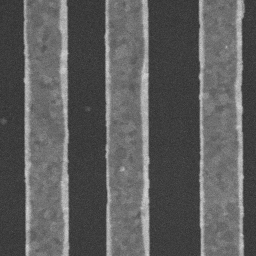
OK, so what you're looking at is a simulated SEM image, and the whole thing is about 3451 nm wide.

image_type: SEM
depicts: lines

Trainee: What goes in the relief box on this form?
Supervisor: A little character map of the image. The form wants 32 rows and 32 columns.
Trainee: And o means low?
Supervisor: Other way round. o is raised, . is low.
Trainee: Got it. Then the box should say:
...ooooo.....ooooo.......ooooo..
...ooooo.....ooooo.......ooooo..
...ooooo.....ooooo.......ooooo..
...ooooo.....ooooo.......ooooo..
...ooooo.....ooooo.......ooooo..
...ooooo.....ooooo.......ooooo..
...ooooo.....ooooo.......ooooo..
...ooooo.....ooooo.......ooooo..
...ooooo.....ooooo.......ooooo..
...ooooo.....ooooo.......ooooo..
...ooooo.....ooooo.......ooooo..
...ooooo.....ooooo.......ooooo..
...ooooo.....ooooo.......ooooo..
...ooooo.....ooooo.......ooooo..
...ooooo.....ooooo.......ooooo..
...ooooo.....ooooo.......ooooo..
...ooooo.....ooooo.......ooooo..
...ooooo.....ooooo.......ooooo..
...ooooo.....ooooo.......ooooo..
...ooooo.....ooooo.......ooooo..
...ooooo.....ooooo.......ooooo..
...ooooo.....ooooo.......ooooo..
...ooooo.....ooooo.......ooooo..
...ooooo.....ooooo.......ooooo..
...ooooo.....ooooo.......ooooo..
...ooooo.....ooooo.......ooooo..
...ooooo.....ooooo.......ooooo..
...ooooo.....ooooo.......ooooo..
...ooooo.....ooooo.......ooooo..
...ooooo.....ooooo.......ooooo..
...ooooo.....ooooo.......ooooo..
...ooooo.....ooooo.......ooooo..